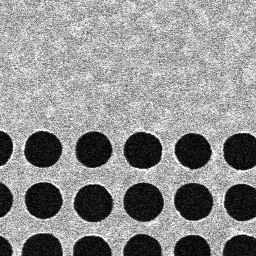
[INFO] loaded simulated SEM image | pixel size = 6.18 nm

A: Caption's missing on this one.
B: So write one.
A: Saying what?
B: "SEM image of a regular array of holes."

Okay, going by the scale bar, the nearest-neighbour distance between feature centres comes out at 0.309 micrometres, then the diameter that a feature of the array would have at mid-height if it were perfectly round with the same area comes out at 233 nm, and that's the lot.